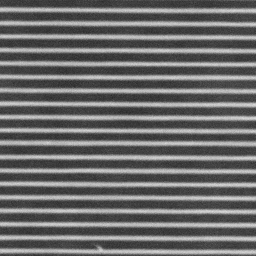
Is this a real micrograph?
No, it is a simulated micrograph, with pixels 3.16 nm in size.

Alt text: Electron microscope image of parallel lines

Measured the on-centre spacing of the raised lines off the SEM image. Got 13.4 px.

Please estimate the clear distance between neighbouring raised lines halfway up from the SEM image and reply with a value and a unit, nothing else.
0.0324 micrometres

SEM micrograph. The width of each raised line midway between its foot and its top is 11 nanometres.